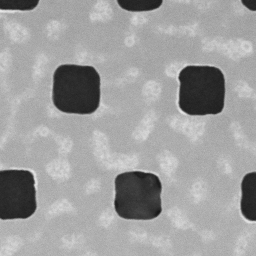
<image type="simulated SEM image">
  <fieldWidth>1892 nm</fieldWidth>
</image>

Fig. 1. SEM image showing holes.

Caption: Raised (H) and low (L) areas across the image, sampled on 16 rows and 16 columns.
LLHHHHHHLLHHHHHH
HHHHHHHHHHHHHHHH
HHHHHHHHHHHHHHHH
HHHHHHHHHHHHHHHH
HHHLLLHHHHHLLLHH
HHHLLLHHHHHLLLHH
HHHLLLHHHHHLLLHH
HHHHHHHHHHHHHHHH
HHHHHHHHHHHHHHHH
HHHHHHHHHHHHHHHH
HHHHHHHHHHHHHHHH
LLHHHHHLLLHHHHHL
LLHHHHHLLLHHHHHL
LLHHHHHHLLHHHHHL
HHHHHHHHHHHHHHHH
HHHHHHHHHHHHHHHH